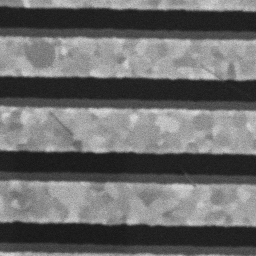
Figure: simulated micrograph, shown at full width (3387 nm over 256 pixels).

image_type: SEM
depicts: lines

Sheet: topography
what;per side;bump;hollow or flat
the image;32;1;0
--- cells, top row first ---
11111111111111111111111111111111
00000000000000000000000000000000
00000000000000000000000000000000
00000000000000000000000000000000
11111111111111111111111111111111
11111111111111111111111111111111
11111111111111111111111111111111
11111111111111111111111111111111
11111111111111111111111111111111
00111111111111111111111111111111
00000000000000000000000000000000
00000000000000000000000000000000
11111111111000000000000000000000
11111111111111111111111111111111
11111111111111111111111111111111
11111111111111111111111111111111
11111111111111111111111111111111
11111111111111111111111111111111
11111111111111111111111111111111
00000000000000000000000000000000
00000000000000000000000000000000
10000000000000000000000000000000
11111111111111111111111111111111
11111111111111111111111111111111
11111111111111111111111111111111
11111111111111111111111111111111
11111111111111111111111111111111
11111111111111111111111111111111
00000000000000000000000000000000
00000000000000000000000000000000
11111111000000000000000000000000
11111111111111111111111111111111